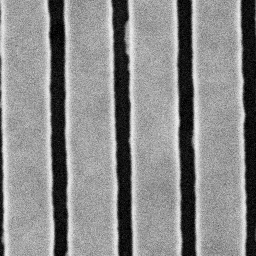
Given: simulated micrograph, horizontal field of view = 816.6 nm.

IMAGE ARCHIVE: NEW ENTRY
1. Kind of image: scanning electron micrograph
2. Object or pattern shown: lines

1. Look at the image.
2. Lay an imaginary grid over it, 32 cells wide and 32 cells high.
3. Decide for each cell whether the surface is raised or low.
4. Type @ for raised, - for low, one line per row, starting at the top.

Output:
@@@@@@--@@@@@@--@@@@@@--@@@@@@--
@@@@@@--@@@@@@--@@@@@@--@@@@@@--
@@@@@@--@@@@@@--@@@@@@--@@@@@@--
@@@@@@--@@@@@@--@@@@@@--@@@@@@--
@@@@@@--@@@@@@--@@@@@@--@@@@@@--
@@@@@@--@@@@@@--@@@@@@--@@@@@@--
@@@@@@--@@@@@@--@@@@@@--@@@@@@--
@@@@@@--@@@@@@--@@@@@@--@@@@@@--
@@@@@@--@@@@@@--@@@@@@--@@@@@@--
@@@@@@--@@@@@@--@@@@@@--@@@@@@--
@@@@@@--@@@@@@--@@@@@@--@@@@@@--
@@@@@@--@@@@@@--@@@@@@--@@@@@@--
@@@@@@--@@@@@@--@@@@@@--@@@@@@--
@@@@@@--@@@@@@--@@@@@@--@@@@@@--
@@@@@@--@@@@@@--@@@@@@--@@@@@@@-
@@@@@@--@@@@@@--@@@@@@--@@@@@@--
@@@@@@--@@@@@@--@@@@@@--@@@@@@--
@@@@@@--@@@@@@--@@@@@@--@@@@@@--
@@@@@@--@@@@@@--@@@@@@--@@@@@@--
@@@@@@--@@@@@@--@@@@@@--@@@@@@--
@@@@@@--@@@@@@---@@@@@--@@@@@@@-
@@@@@@---@@@@@@--@@@@@--@@@@@@@-
-@@@@@---@@@@@@--@@@@@---@@@@@@-
-@@@@@--@@@@@@@--@@@@@--@@@@@@@-
-@@@@@--@@@@@@@--@@@@@@--@@@@@@-
-@@@@@@-@@@@@@@--@@@@@---@@@@@@-
-@@@@@@--@@@@@@--@@@@@@--@@@@@@-
-@@@@@@--@@@@@@--@@@@@---@@@@@@-
@@@@@@@--@@@@@@--@@@@@---@@@@@@-
-@@@@@@--@@@@@@--@@@@@@--@@@@@@-
-@@@@@@--@@@@@@--@@@@@@--@@@@@@-
-@@@@@@--@@@@@@--@@@@@@--@@@@@@-